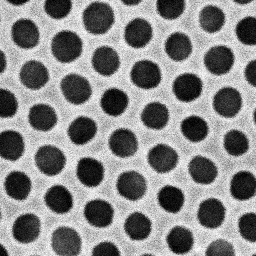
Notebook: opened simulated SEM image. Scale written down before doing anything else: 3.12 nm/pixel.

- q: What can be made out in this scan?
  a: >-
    a regular array of holes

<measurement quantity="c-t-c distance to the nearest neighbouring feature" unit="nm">130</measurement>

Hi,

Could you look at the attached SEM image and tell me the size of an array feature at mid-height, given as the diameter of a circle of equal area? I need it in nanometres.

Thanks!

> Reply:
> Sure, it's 93.3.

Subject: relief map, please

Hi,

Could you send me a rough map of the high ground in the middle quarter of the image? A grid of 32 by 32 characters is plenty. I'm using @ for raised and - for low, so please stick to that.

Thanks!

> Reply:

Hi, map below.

@@@@@@@-------@@@-------@@@@@@@@
@@@@@@@@------@@@-------@@@@@@@@
@--@@@@@@---@@@@--------@@@@@@--
-----@@@@@@@@@@@---------@@@----
------@@@@@@@@@@@-------@@@-----
-------@@@@@@@@@@@-----@@@@-----
-------@@@@---@@@@@@@@@@@@@-----
-------@@@------@@@@@@@@@@@-----
-------@@-------@@@@@@@@@@@@----
@----@@@@-------@@@@@@--@@@@@@--
@@@@@@@@@-------@@@@------@@@@@@
@@@@@@@@@@-----@@@@@------@@@@@@
@@@@@@@@@@@----@@@@-------@@@@@@
@@@----@@@@@@@@@@@@-------@@@@--
@@------@@@@@@@@@@@-------@@@---
@-------@@@@@@@@@@@@-----@@@@---
@-------@@@@@----@@@@@@-@@@@@---
@-------@@@@------@@@@@@@@@@@@--
@------@@@@-------@@@@@@@@@@@@--
@@----@@@@@--------@@@@@@@@@@@@@
@@@@@@@@@@@--------@@@----@@@@@@
@@@@@@@@@@@@------@@@-------@@@@
@@@@@@@@@@@@------@@@--------@@@
@@@@---@@@@@@@--@@@@@--------@@@
-@@@-----@@@@@@@@@@@@--------@@-
@@@-------@@@@@@@@@@@-------@@@-
@@@-------@@@@@@@@@@@@-----@@@@-
@@@-------@@@@-----@@@@@@@@@@@@-
@@@-------@@@-------@@@@@@@@@@@@
@@@@-----@@@@--------@@@@@@@@@@@
@@@@@----@@@@--------@@@@---@@@@
-@@@@@@@@@@@@--------@@@-----@@@